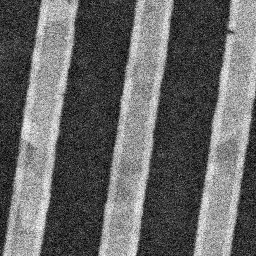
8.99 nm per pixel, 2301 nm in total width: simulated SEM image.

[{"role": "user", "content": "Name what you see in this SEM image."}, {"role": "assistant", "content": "one or a few lines or trenches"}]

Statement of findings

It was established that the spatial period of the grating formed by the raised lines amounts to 94.1 pixels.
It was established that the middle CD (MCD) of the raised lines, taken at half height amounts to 251 nm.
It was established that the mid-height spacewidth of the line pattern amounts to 592 nm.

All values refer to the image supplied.